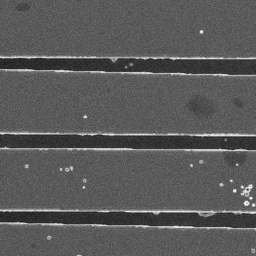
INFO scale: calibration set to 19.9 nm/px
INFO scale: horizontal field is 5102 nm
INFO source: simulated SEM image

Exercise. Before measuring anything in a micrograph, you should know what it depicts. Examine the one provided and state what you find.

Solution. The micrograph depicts lines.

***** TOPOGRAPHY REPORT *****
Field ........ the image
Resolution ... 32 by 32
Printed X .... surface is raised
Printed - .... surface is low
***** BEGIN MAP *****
XXXXXXXXXXXXXXXXXXXXXXXXXXXXXXXX
XXXXXXXXXXXXXXXXXXXXXXXXXXXXXXXX
XXXXXXXXXXXXXXXXXXXXXXXXXXXXXXXX
XXXXXXXXXXXXXXXXXXXXXXXXXXXXXXXX
XXXXXXXXXXXXXXXXXXXXXXXXXXXXXXXX
XXXXXXXXXXXXXXXXXXXXXXXXXXXXXXXX
XXXXXXXXXXXXXXXXXXXXXXXXXXXXXXXX
--------------------------------
--------------------------------
XXXXXXXXXXXXXXXXXXXXXXXXXXXXXXXX
XXXXXXXXXXXXXXXXXXXXXXXXXXXXXXXX
XXXXXXXXXXXXXXXXXXXXXXXXXXXXXXXX
XXXXXXXXXXXXXXXXXXXXXXXXXXXXXXXX
XXXXXXXXXXXXXXXXXXXXXXXXXXXXXXXX
XXXXXXXXXXXXXXXXXXXXXXXXXXXXXXXX
XXXXXXXXXXXXXXXXXXXXXXXXXXXXXXXX
XXXXXXXXXXXXXXXXXXXXXXXXXXXXXXXX
--------------------------------
X-------------------------------
XXXXXXXXXXXXXXXXXXXXXXXXXXXXXXXX
XXXXXXXXXXXXXXXXXXXXXXXXXXXXXXXX
XXXXXXXXXXXXXXXXXXXXXXXXXXXXXXXX
XXXXXXXXXXXXXXXXXXXXXXXXXXXXXXXX
XXXXXXXXXXXXXXXXXXXXXXXXXXXXXXXX
XXXXXXXXXXXXXXXXXXXXXXXXXXXXXXXX
XXXXXXXXXXXXXXXXXXXXXXXXXXXXXXXX
------------------------------XX
--------------------------------
XXXXXXXXXXXXXXXXXXXXXXXXXXXXX---
XXXXXXXXXXXXXXXXXXXXXXXXXXXXXXXX
XXXXXXXXXXXXXXXXXXXXXXXXXXXXXXXX
XXXXXXXXXXXXXXXXXXXXXXXXXXXXXXXX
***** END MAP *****